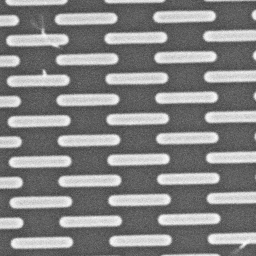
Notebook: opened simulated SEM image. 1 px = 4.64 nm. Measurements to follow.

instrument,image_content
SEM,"groups of lines, slits or small figures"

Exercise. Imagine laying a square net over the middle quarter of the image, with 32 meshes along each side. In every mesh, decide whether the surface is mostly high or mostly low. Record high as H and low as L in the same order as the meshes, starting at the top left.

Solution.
LLLLLLLLLLLLLLLLLLLLLLLLLLLLLLLL
LLLLLLLLLLLLLLLLLLLLLLLLLLLLLLLL
LLLLLLLLLLLLLLHHHHHHHHHHHLLLLLLL
HLLLLLLLLLLHHHHHHHHHHHHHHHLLLLLL
HLLLLLLLLLLHHHHHHHHHHHHHHLLLLLLL
LLLLLLLLLLLLLLLLLLLLLLLLLLLLLLLL
LLLLLLLLLLLLLLLLLLLLLLLLLLLLLLLL
LLLLLLLLLLLLLLLLLLLLLLLLHHHHHHHH
HHHHHHHHHHHHHHLLLLLLLLLHHHHHHHHH
HHHHHHHHHHHHHLLLLLLLLLLLHHHHHLLL
LLLLLLLLLLLLLLLLLLLLLLLLLLLLLLLL
LLLLLLLLLLLLLLLLLLLLLLLLLLLLLLLL
LLLLLLLLLLLLLLLLLLLHHHHHHLLLLLLL
HLLLLLLLLLLHHHHHHHHHHHHHHHLLLLLL
HLLLLLLLLLLHHHHHHHHHHHHHHHLLLLLL
LLLLLLLLLLLLLLLLLLLLLLLLLLLLLLLL
LLLLLLLLLLLLLLLLLLLLLLLLLLLLLLLL
LLLLLLLLLLLLLLLLLLLLLLLLLLLLHHHH
HHHHHHHHHHHHHHLLLLLLLLLHHHHHHHHH
HHHHHHHHHHHHHHLLLLLLLLLLHHHHHHHH
LLLLLLLLLLLLLLLLLLLLLLLLLLLLLLLL
LLLLLLLLLLLLLLLLLLLLLLLLLLLLLLLL
LLLLLLLLLLLLLLLLLLLLLLLLLLLLLLLL
HLLLLLLLLLLHHHHHHHHHHHHHHHLLLLLL
HHLLLLLLLLLHHHHHHHHHHHHHHHLLLLLL
HLLLLLLLLLLLLLLLLLLLLLLLLLLLLLLL
LLLLLLLLLLLLLLLLLLLLLLLLLLLLLLLL
LLLLLLLLLLLLLLLLLLLLLLLLLLLHHHHH
HHHHHHHHHHHHHHLLLLLLLLLLHHHHHHHH
HHHHHHHHHHHHHHLLLLLLLLLLHHHHHHHH
HHLLLLLLLLLLLLLLLLLLLLLLLLLLLLLL
LLLLLLLLLLLLLLLLLLLLLLLLLLLLLLLL